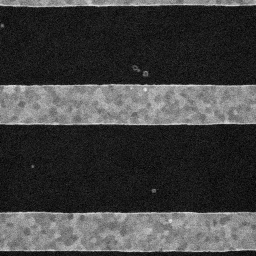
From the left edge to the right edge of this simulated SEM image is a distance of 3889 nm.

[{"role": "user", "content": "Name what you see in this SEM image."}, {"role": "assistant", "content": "one or a few lines or trenches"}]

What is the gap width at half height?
84.1 pixels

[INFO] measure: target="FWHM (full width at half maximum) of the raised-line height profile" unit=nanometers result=587